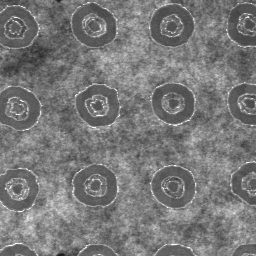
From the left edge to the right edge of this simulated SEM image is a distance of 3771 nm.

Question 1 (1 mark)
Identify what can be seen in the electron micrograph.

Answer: ring-shaped raised bodies with a dot in the middle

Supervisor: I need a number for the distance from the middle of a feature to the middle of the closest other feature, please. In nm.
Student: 1150